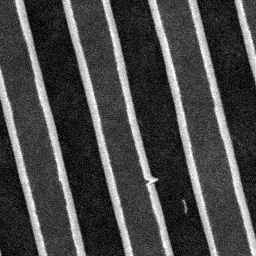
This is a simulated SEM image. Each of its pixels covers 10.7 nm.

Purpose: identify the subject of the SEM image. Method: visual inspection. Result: one or a few lines or trenches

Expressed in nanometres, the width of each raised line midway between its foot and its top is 438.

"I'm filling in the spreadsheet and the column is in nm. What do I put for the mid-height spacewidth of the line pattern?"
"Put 470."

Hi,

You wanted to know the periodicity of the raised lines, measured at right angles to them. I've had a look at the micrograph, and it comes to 900 nanometers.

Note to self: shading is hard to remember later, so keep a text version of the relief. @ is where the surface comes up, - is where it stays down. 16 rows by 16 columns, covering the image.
@---@@@---@@---@
@@--@@@---@@---@
@@---@@---@@@--@
@@---@@---@@@---
@@---@@@---@@---
@@@--@@@---@@---
@@@---@@---@@@--
-@@---@@---@@@--
-@@---@@@--@@@--
-@@@--@@@---@@--
-@@@---@@---@@@-
-@@@---@@@--@@@-
--@@---@@@--@@@-
--@@@--@@@---@@-
--@@@---@@---@@@
--@@@---@@@--@@@